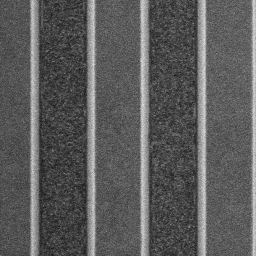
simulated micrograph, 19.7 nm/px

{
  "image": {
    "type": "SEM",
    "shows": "one or a few lines or trenches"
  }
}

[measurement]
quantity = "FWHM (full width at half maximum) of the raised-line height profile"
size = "1080 nm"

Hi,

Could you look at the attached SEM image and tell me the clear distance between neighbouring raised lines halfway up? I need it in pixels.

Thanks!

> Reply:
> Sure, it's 55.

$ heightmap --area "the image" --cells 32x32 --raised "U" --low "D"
UUUUDDDDDDDUUUUUUUDDDDDDDUUUUUUU
UUUUDDDDDDDUUUUUUUDDDDDDDUUUUUUU
UUUUDDDDDDDUUUUUUUDDDDDDDUUUUUUU
UUUUDDDDDDDUUUUUUUDDDDDDDUUUUUUU
UUUUDDDDDDDUUUUUUUDDDDDDDUUUUUUU
UUUUDDDDDDDUUUUUUUDDDDDDDUUUUUUU
UUUUDDDDDDDUUUUUUUDDDDDDDUUUUUUU
UUUUDDDDDDDUUUUUUUDDDDDDDUUUUUUU
UUUUDDDDDDDUUUUUUUDDDDDDDUUUUUUU
UUUUDDDDDDDUUUUUUUDDDDDDDUUUUUUU
UUUUDDDDDDDUUUUUUUDDDDDDDUUUUUUU
UUUUDDDDDDDUUUUUUUDDDDDDDUUUUUUU
UUUUDDDDDDDUUUUUUUDDDDDDDUUUUUUU
UUUUDDDDDDDUUUUUUUDDDDDDDUUUUUUU
UUUUDDDDDDDUUUUUUUDDDDDDDUUUUUUU
UUUUDDDDDDDUUUUUUUDDDDDDDUUUUUUU
UUUUDDDDDDDUUUUUUUDDDDDDDUUUUUUU
UUUUDDDDDDDUUUUUUUDDDDDDDUUUUUUU
UUUUDDDDDDDUUUUUUUDDDDDDDUUUUUUU
UUUUDDDDDDDUUUUUUUDDDDDDDUUUUUUU
UUUUDDDDDDDUUUUUUUDDDDDDDUUUUUUU
UUUUDDDDDDDUUUUUUUDDDDDDDUUUUUUU
UUUUDDDDDDDUUUUUUUDDDDDDDUUUUUUU
UUUUDDDDDDDUUUUUUUDDDDDDDUUUUUUU
UUUUDDDDDDDUUUUUUUDDDDDDDUUUUUUU
UUUUDDDDDDDUUUUUUUDDDDDDDUUUUUUU
UUUUDDDDDDDUUUUUUUDDDDDDDUUUUUUU
UUUUDDDDDDDUUUUUUUDDDDDDDUUUUUUU
UUUUDDDDDDDUUUUUUUDDDDDDDUUUUUUU
UUUUDDDDDDDUUUUUUUDDDDDDDUUUUUUU
UUUUDDDDDDDUUUUUUUDDDDDDDUUUUUUU
UUUUDDDDDDDUUUUUUUDDDDDDDUUUUUUU